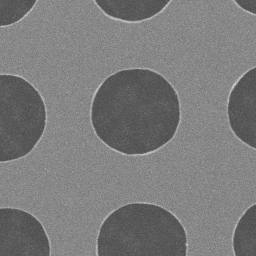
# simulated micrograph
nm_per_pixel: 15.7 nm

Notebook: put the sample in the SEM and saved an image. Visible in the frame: holes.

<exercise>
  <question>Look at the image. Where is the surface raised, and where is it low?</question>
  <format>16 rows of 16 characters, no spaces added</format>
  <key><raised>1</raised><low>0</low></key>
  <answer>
0011110000111110
0111111111111111
1111111111111111
1111111111111111
1111111000111111
0011110000011110
0001110000011100
0001110000011100
0001110000011110
0011111101111111
1111111111111111
1111111111111111
1111111111111111
0011111000011110
0001110000001110
0001110000001110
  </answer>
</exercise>